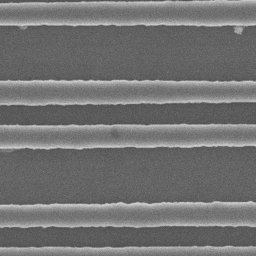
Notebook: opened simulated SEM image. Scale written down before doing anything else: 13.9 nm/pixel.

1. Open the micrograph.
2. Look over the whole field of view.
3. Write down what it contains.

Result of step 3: lines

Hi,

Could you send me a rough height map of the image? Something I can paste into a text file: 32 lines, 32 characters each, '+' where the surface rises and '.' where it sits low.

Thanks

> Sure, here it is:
++++++++++++++++++++++++++++++++
++++++++++++++++++++++++++++++++
++++++++++++++++++++++++++++++++
................................
................................
................................
................................
................................
................................
................................
++++++++++++++++++++++++++++++++
++++++++++++++++++++++++++++++++
++++++++++++++++++++++++++++++++
................................
................................
................................
++++++++++++++++++++++++++++++++
++++++++++++++++++++++++++++++++
+.+++++++++.....................
................................
................................
................................
................................
................................
................................
..............++++.+++++++++++++
++++++++++++++++++++++++++++++++
++++++++++++++++++++++++++++++++
................................
................................
................................
++++++++++++++++++++++++++++++++